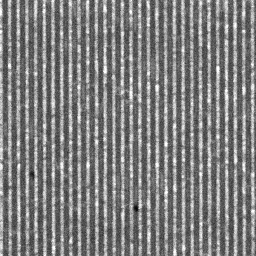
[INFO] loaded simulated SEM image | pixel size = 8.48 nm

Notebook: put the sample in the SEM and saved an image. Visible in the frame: parallel lines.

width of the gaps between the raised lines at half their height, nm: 59.3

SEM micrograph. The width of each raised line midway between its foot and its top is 0.0117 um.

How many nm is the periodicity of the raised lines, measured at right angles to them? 73.5